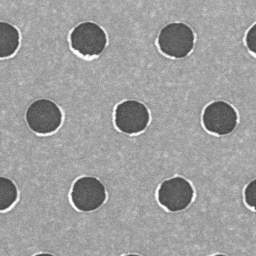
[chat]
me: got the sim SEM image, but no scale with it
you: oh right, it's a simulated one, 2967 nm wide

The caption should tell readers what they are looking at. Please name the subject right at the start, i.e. holes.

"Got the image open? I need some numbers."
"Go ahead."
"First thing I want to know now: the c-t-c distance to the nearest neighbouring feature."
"1020 nm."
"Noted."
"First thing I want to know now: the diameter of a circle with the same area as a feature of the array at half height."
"0.407 um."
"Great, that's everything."